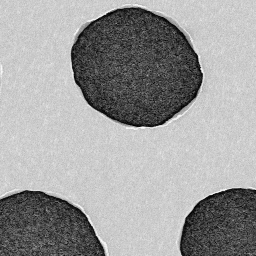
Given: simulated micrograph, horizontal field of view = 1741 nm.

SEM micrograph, holes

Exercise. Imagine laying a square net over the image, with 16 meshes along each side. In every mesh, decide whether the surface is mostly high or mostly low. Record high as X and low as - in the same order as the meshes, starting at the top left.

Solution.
XXXXXXXXXXXXXXXX
XXXXX------XXXXX
XXXXX-------XXXX
XXXX--------XXXX
XXXXX--------XXX
XXXXX--------XXX
XXXXXX------XXXX
XXXXXXX----XXXXX
XXXXXXXXXXXXXXXX
XXXXXXXXXXXXXXXX
XXXXXXXXXXXXXXXX
XXXXXXXXXXXXXXXX
----XXXXXXXXX---
-----XXXXXXX----
------XXXXX-----
------XXXXX-----